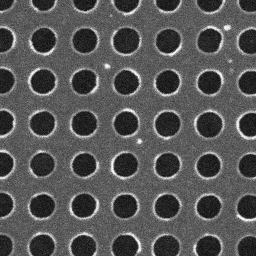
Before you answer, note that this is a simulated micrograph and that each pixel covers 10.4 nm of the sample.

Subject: a regular array of holes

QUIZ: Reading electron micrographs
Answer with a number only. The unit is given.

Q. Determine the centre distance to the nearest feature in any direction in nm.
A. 424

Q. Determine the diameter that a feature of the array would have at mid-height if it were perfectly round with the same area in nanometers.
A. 261